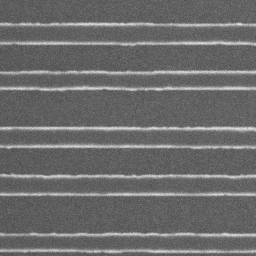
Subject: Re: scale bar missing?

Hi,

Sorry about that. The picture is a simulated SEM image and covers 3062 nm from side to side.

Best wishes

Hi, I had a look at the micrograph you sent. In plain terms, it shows lines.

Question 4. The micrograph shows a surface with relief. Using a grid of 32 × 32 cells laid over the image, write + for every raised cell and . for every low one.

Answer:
................................
................................
................................
++++++++++++++++++++++++++++++++
++++++++++++++++++++++++++++++++
...............+................
................................
................................
................................
++++++++++++++++++++++++++++++++
++++++++++++++++++++++++++++++++
................................
................................
................................
................................
................................
++++++++++++++++++++++++++++++++
++++++++++++++++++++++++++++++++
................................
................................
................................
................................
++++++++++++++++++++++++++++++++
++++++++++++++++++++++++++++++++
................................
................................
................................
................................
................................
++++++++++++++++++++++++++++++++
++++++++++++++++++++++++++++++++
................................